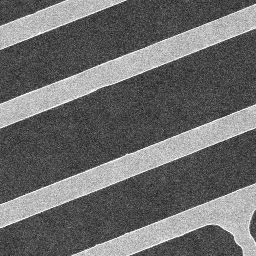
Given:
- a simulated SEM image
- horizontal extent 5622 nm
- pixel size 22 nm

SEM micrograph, one or a few lines or trenches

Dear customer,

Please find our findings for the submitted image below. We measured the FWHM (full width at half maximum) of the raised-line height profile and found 478 nm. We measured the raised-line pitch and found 1900 nanometers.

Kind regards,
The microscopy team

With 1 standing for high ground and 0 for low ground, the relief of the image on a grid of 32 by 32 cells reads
00000001111111000000000000000000
00000111111100000000000000000011
00111111100000000000000000011111
11111110000000000000000011111111
11110000000000000000001111011000
11000000000000000001111111000000
00000000000000000111111100000000
00000000000000011111110000000000
00000000000011011110000000000000
00000000011111111000000000000000
00000001111111000000000000000000
00001111111000000000000000000000
01111111100000000000000000000000
11111100000000000000000000000000
11110000000000000000000000001111
10000000000000000000000000011111
00000000000000000000000100111110
00000000000000000000011100110000
00000000000000000001111110000000
00000000000000001111111000000000
00000000000001011111000000000000
00000000000111111000000000000000
00000000111111100000000000000000
00000111111110000000000000000001
00011111110000000000000000001111
11111111000000000000000001111111
11111000000000000000000111111111
11000000000000000000111111111110
00000000000000000011111110001110
00000000000000011111010000000110
00000000000001111111000000000011
00000000000111111000000000000011